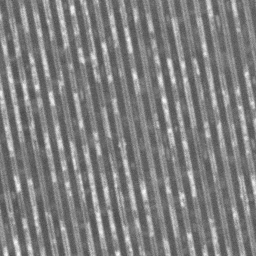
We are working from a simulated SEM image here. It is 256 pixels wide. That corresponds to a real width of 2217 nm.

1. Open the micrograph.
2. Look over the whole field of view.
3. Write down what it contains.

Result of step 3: parallel lines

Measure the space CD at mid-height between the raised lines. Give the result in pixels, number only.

7.74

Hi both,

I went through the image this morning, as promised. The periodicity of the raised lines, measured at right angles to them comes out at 106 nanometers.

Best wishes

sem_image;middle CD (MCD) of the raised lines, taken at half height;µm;0.0341